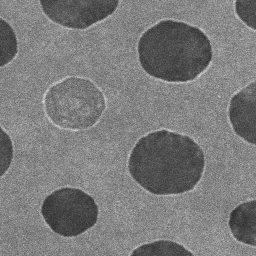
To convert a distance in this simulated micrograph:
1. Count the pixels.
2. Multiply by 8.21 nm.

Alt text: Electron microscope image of holes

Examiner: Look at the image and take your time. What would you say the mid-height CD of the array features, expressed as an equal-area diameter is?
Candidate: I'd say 510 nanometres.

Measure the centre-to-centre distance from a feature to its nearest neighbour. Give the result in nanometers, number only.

885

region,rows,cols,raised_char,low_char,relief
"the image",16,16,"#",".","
###....########.
.###..####..###.
.########....###
.########....###
#########....###
###...#########.
###....#######..
###...########..
.########...###.
.#######.....###
.#######.....###
#########...####
###...##########
###...########..
###..#########..
#########...####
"